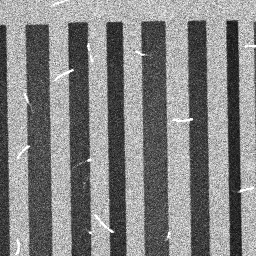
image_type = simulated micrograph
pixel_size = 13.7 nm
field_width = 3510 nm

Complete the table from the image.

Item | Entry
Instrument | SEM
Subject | parallel lines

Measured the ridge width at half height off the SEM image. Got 260 nanometres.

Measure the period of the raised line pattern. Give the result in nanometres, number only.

537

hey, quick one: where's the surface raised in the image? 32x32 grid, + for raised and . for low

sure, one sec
++++++++++++++++++++++++++++++++
++++++++++++++++++++++++++++++++
++++++++++++++++++++++++++++++++
.++...++...++..+++...++...++..++
.++...++...++..+++...++...++..++
.++...++...++..+++...+++..++..++
.++...++...++..+++...++...++..++
.++...++...++..+++...++...++..++
.++...+++..++...++...++...++..++
.++...+++..++...++...++...++..++
.++...+++..++...++...++...++..++
.++...+++..++...++...++...++..++
.++...+++..++...++...+++..++..++
.++...+++..++...++...+++..++..++
.++...+++..++...++...+++..++..++
.++...+++..++...++...+++..++..++
.++...+++..+++..++...+++..++..++
.++...+++..+++..++...+++..++..++
.++...+++..+++..++...+++..++..++
.++...+++..+++..++...+++..++..++
.++...+++..+++..++...+++..+++.++
.+++..+++..+++..++...+++..+++.++
.+++..+++..+++..++...+++..+++.++
.+++..+++..+++..++...+++..+++.++
.+++...++..+++..++...+++..+++.++
.+++...++..+++..++...+++..+++.++
.++....++..+++..++...+++..+++.++
.+++...++..+++..++...+++..+++.++
.+++...++..+++..++...+++..+++.++
.+++...++..+++..++...+++..+++.++
.+++...++..+++..++...+++..+++.++
.+++...++..+++..++...+++..+++.++